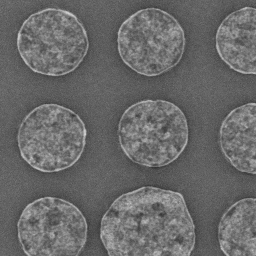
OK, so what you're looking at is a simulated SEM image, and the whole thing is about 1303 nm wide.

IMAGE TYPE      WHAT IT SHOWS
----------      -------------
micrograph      raised bodies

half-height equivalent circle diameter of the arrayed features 342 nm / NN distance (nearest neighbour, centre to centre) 0.475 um